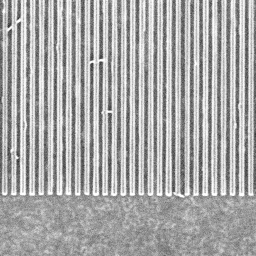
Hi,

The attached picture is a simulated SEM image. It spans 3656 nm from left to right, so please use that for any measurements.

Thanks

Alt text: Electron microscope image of parallel lines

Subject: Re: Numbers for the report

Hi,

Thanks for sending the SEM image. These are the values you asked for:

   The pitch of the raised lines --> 0.13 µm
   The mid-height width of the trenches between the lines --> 73.2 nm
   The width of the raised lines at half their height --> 50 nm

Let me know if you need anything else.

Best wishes